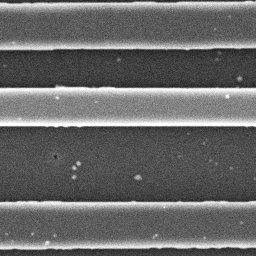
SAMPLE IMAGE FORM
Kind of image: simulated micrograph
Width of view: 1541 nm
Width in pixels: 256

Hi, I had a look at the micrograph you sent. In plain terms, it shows lines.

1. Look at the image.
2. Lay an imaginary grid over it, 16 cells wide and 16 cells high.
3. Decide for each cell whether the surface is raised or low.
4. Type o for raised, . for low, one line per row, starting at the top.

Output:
oooooooooooooooo
oooooooooooooooo
oooooooooooooooo
................
................
...ooo..........
oooooooooooooooo
oooooooooooooooo
................
................
................
................
................
oooooooooooooooo
oooooooooooooooo
oooooooooo.oo...